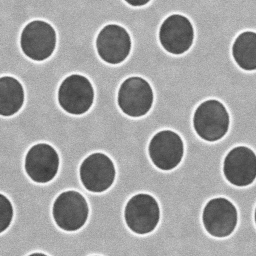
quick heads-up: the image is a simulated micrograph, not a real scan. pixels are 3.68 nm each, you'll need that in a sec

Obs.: a regular array of holes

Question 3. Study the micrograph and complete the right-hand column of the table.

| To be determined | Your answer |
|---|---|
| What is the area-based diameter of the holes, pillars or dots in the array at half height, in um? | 0.141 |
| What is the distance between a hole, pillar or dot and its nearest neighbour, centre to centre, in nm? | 210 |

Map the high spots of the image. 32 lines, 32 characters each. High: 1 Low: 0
11111111111111110011111111111111
11111111111111111111111111111111
11111111111111111111100011111111
11100001111110011111000011111111
11100001111100001111000011111100
11100001111100001111000011111000
11100001111100001111100111111000
11110111111110001111111111111000
11111111111111111111111111111100
11111111100111111111111111111111
00011111000011100001111111111111
00011110000011100001111111111111
00011110000011100001111111011111
00011111000111100001111110001111
01111111111111110011111100000111
11111111111111111111111100000111
11111111111111111111001100001111
11111111111111111110000111011111
11110001111111111110000111111001
11100001111001111110000111110000
11100001110000111110001111110000
11100001110000111111111111110000
11110011110000111111111111110000
11111111111000111111111111111111
01111110001111111001111111111111
01111110000111110000111111000111
00111110000111110000111110000011
01111110000111110000111110000011
01111111001111110001111111000111
11111111111111111111111111000111
11111111111111111111111111111111
11111111111111111111111111111111